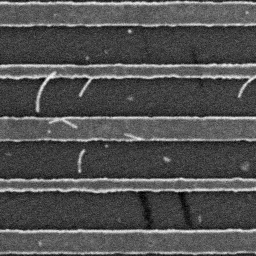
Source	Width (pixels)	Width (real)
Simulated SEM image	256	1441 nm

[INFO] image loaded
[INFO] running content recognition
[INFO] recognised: lines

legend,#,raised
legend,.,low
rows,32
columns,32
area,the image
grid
################################
################################
################################
................................
................................
................................
................................
................................
################################
################################
................................
................................
................................
................................
................................
################################
################################
################################
................................
................................
................................
................................
###.############################
################################
................................
................................
................................
................................
................................
################################
################################
################################